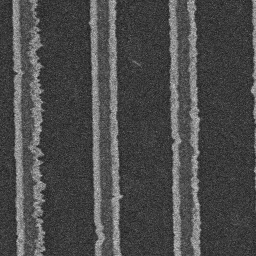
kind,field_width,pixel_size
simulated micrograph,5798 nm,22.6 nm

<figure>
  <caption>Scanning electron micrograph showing one or a few lines or trenches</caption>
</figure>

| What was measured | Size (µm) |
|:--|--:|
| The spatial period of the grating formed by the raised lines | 1.78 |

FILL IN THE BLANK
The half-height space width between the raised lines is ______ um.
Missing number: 1.34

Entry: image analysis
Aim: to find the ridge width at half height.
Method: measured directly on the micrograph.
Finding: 442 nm